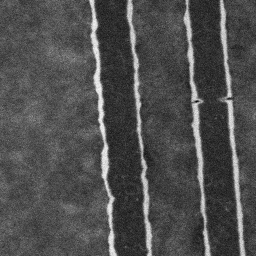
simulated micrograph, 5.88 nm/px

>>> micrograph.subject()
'one or a few lines or trenches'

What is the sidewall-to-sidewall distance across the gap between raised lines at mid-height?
332 nanometres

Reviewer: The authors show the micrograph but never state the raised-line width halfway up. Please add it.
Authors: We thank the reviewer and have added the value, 0.213 microns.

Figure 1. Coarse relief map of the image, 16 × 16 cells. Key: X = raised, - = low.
------XX----XX--
------XX----XX--
------XX----XX--
------XX----XX--
------XXX---XX--
------XXX---XX--
------XXX---XX--
------XXX---XX--
------XXX---XXX-
-------XX---XXX-
-------XX----XX-
-------XX----XX-
-------XX----XX-
-------XX----XX-
-------XX----XX-
-------XX----XX-